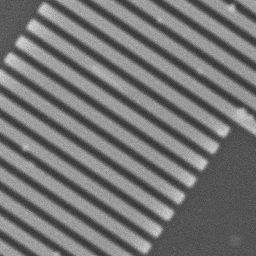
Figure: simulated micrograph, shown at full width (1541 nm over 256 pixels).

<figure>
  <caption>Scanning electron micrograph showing groups of lines, slits or small figures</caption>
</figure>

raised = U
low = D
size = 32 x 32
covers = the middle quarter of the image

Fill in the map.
DDDDDUUUUDDDDDUUUUDDDDDUUUUDDDDD
UUDDDDUUUUUDDDDUUUUUDDDDUUUUUDDD
UUUDDDDDUUUUDDDDDUUUUDDDDDUUUUDD
UUUUUDDDDUUUUUDDDDUUUUUDDDDUUUUU
DDUUUUDDDDDUUUUDDDDDUUUUDDDDDUUU
DDDUUUUUDDDDUUUUUDDDDUUUUUDDDDUU
DDDDDUUUUDDDDDUUUUDDDDDUUUUDDDDU
UUDDDDUUUUUDDDDUUUUUDDDDUUUUUDDD
UUUDDDDDUUUUDDDDDUUUUDDDDDUUUUDD
UUUUUDDDDUUUUUDDDDUUUUUDDDDUUUUU
DUUUUUDDDDUUUUUDDDDUUUUUDDDDUUUU
DDDUUUUUDDDDUUUUUDDDDUUUUUDDDDUU
DDDDDUUUUDDDDDUUUUDDDDDUUUUDDDDD
UUDDDDUUUUUDDDDUUUUUDDDDUUUUUDDD
UUUDDDDDUUUUDDDDUUUUUDDDDUUUUUDD
UUUUUDDDDUUUUUDDDDUUUUUDDDDUUUUU
DUUUUUDDDDUUUUUDDDDUUUUUDDDDUUUU
DDDUUUUUDDDDUUUUUDDDDUUUUUDDDDUU
DDDDUUUUUDDDDUUUUUDDDDUUUUUDDDDU
UUDDDDUUUUUDDDDUUUUUDDDDUUUUUDDD
UUUDDDDUUUUUDDDDUUUUUDDDDUUUUUDD
UUUUUDDDDUUUUUDDDDUUUUDDDDDUUUUD
DUUUUUDDDDUUUUUDDDDUUUUUDDDDUUUU
DDDUUUUUDDDDUUUUDDDDDUUUUUDDDDUU
DDDDUUUUUDDDDUUUUUDDDDUUUUUDDDDU
UDDDDDUUUUUDDDDUUUUDDDDDUUUUUDDD
UUUDDDDUUUUUDDDDUUUUUDDDDUUUUUDD
UUUUUDDDDUUUUDDDDDUUUUDDDDDUUUUD
DUUUUUDDDDUUUUUDDDDUUUUUDDDDUUUU
DDDUUUUDDDDDUUUUDDDDDUUUUDDDDDUU
DDDDUUUUUDDDDUUUUUDDDDUUUUUDDDDD
UDDDDDUUUUDDDDDUUUUDDDDDUUUUDDDD